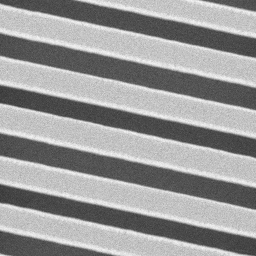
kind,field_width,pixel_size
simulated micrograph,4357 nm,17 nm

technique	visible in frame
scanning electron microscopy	lines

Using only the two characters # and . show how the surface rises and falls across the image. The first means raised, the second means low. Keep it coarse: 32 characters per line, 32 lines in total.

............################....
#####............###############
#########............###########
##############............######
..#################............#
......##################........
...........##################...
##..............################
#######.............############
############.............#######
#################.............##
....#################...........
.........#################......
###...........#################.
#######...........##############
############...........#########
#################...........####
....##################..........
.........#################......
.............##################.
#####.............##############
##########.............#########
##############.............#####
..#################.............
.......#################........
...........#################....
#####...........################
##########...........###########
###############..........#######
...#################...........#
........#################.......
.............################...